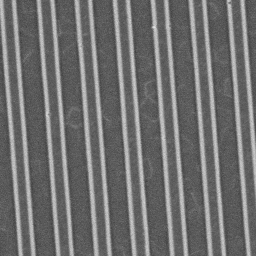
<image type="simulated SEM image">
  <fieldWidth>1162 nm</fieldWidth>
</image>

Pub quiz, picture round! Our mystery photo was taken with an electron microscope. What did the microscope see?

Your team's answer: parallel lines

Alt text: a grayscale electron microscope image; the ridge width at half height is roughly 61.6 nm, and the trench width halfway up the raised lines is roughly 110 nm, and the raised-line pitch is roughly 172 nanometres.